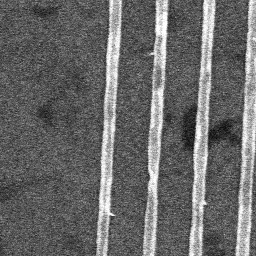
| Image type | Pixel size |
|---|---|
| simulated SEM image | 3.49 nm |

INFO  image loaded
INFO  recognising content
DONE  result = parallel lines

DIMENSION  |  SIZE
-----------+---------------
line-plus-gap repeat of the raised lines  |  0.164 µm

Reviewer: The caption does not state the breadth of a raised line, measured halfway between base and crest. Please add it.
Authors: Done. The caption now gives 35.3 nanometers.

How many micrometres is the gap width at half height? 0.13